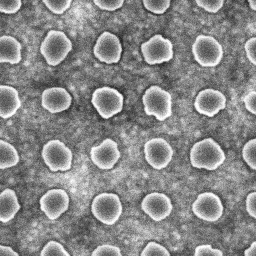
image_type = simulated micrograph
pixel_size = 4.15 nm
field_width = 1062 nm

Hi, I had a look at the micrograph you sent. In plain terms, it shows a regular array of raised bodies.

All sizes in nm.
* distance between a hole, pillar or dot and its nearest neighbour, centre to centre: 208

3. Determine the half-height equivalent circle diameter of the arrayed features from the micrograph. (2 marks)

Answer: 28.7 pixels